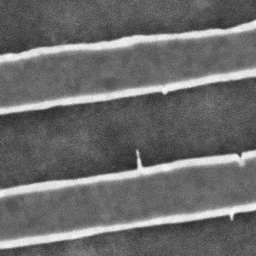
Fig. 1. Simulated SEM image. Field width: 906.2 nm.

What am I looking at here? one or a few lines or trenches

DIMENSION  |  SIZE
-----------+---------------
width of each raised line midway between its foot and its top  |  0.19 µm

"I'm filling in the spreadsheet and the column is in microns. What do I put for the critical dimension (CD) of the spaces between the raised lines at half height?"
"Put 0.279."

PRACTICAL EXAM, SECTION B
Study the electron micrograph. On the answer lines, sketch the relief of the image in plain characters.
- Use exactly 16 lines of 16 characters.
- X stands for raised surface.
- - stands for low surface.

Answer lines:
----------------
----------------
--------XXXXXXXX
-XXXXXXXXXXXXXXX
XXXXXXXXXXXXXXXX
XXXXXXXXXXX-----
XXX-------------
----------------
----------------
----------------
----------XXXXXX
----XXXXXXXXXXXX
XXXXXXXXXXXXXXXX
XXXXXXXXXXXXX---
XXXXXX----------
----------------